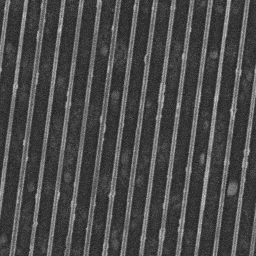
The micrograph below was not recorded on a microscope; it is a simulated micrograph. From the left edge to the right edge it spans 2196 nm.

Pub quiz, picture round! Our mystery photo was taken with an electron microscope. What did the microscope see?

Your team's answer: parallel lines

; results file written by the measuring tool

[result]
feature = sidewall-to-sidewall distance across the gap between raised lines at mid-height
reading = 122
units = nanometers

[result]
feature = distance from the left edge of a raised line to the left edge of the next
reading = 0.157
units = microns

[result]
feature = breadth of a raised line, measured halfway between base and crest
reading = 32.9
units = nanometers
